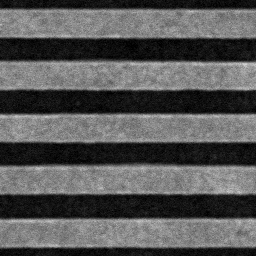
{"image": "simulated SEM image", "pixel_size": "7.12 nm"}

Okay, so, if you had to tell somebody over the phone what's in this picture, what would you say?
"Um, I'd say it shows lines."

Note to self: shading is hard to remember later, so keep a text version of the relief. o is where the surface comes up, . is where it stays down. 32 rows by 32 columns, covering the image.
................................
oooooooooooooooooooooooooooooooo
oooooooooooooooooooooooooooooooo
oooooooooooooooooooooooooooooooo
oooooooooooooooooooooooooooooooo
................................
................................
................................
oooooooooooooooooooooooooooooooo
oooooooooooooooooooooooooooooooo
oooooooooooooooooooooooooooooooo
................................
................................
................................
oooooooooooooooooooooooooooooooo
oooooooooooooooooooooooooooooooo
oooooooooooooooooooooooooooooooo
oooooooooooooooooooooooooooooooo
................................
................................
................................
oooooooooooooooooooooooooooooooo
oooooooooooooooooooooooooooooooo
oooooooooooooooooooooooooooooooo
................................
................................
................................
................................
oooooooooooooooooooooooooooooooo
oooooooooooooooooooooooooooooooo
oooooooooooooooooooooooooooooooo
................................